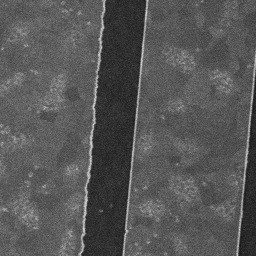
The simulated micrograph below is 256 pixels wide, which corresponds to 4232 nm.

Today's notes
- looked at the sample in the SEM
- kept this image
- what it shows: one or a few lines or trenches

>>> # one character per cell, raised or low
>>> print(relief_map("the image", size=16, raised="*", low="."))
******...*******
******...*******
******...*******
******...*******
******...*******
******...*******
******...*******
******...*******
******..********
******..*******.
******..*******.
*****...*******.
*****...*******.
*****...*******.
*****...*******.
*****...*******.